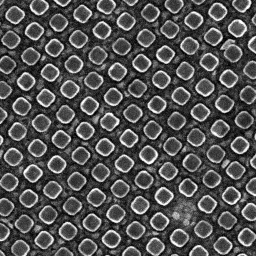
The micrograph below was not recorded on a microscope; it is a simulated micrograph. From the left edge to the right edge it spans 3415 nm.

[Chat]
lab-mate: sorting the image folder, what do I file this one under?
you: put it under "a regular array of raised bodies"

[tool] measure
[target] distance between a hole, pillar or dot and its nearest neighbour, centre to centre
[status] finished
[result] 338 nanometres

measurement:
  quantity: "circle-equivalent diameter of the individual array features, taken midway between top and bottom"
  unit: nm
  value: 224